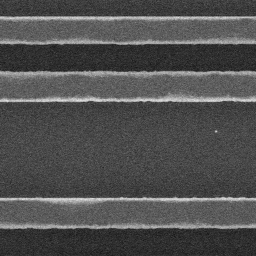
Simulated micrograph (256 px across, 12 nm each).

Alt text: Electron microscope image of lines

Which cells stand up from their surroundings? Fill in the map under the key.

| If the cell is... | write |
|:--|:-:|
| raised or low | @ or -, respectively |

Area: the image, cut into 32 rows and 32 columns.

--------------------------------
--------------------------------
@@@@@@@@@@@@@@@@@@@@@@@@@@@@@@@@
@@@@@@@@@@@@@@@@@@@@@@@@@@@@@@@@
@@@@@@@@@@@@@@@@@@@@@@@@@@@@@@@@
-----@-@------@@@@--------------
--------------------------------
--------------------------------
--------------------------------
@@@@@@@@@@@@@@@@@@@@@@@@@@@@@@@@
@@@@@@@@@@@@@@@@@@@@@@@@@@@@@@@@
@@@@@@@@@@@@@@@@@@@@@@@@@@@@@@@@
@@@@@@@@@@@@@@@@@@@@@@@@@@@@@@@@
--------------------------------
--------------------------------
--------------------------------
--------------------------------
--------------------------------
--------------------------------
--------------------------------
--------------------------------
--------------------------------
--------------------------------
--------------------------------
--------------------------------
@@@@@@@@@@@@@@@@@@@@@@@@@@@@@@@@
@@@@@@@@@@@@@@@@@@@@@@@@@@@@@@@@
@@@@@@@@@@@@@@@@@@@@@@@@@@@@@@@@
----@@--@@-@@--------------@@---
--------------------------------
--------------------------------
--------------------------------